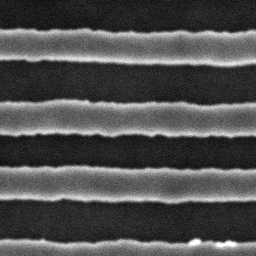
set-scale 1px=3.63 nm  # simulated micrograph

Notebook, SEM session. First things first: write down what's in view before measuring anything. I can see lines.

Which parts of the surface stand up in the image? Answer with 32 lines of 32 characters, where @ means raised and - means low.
--------------------------------
--------------------------------
--------------------------------
--------------------------------
@@@@@@@@@@@@@@@@@@@@@@@@@@@@@@@@
@@@@@@@@@@@@@@@@@@@@@@@@@@@@@@@@
@@@@@@@@@@@@@@@@@@@@@@@@@@@@@@@@
------------@@@@@@@@@@@@@@@@@@@@
--------------------------------
--------------------------------
--------------------------------
--------------------------------
--------------------------------
@@@@@@@@@@@@@@@@@@@@@@@@@@@@@@@@
@@@@@@@@@@@@@@@@@@@@@@@@@@@@@@@@
@@@@@@@@@@@@@@@@@@@@@@@@@@@@@@@@
@@@@@@@@@@@@@@@@@@@@@@@@@@@@@@@@
--------------------------------
--------------------------------
--------------------------------
--------------------------------
@@@@@@@@@@@@@@@@@@@@@@@@@@@@@@@@
@@@@@@@@@@@@@@@@@@@@@@@@@@@@@@@@
@@@@@@@@@@@@@@@@@@@@@@@@@@@@@@@@
@@@@@@@@@@@@@@@@@@@@@@@@@@@@@@@@
--------------------------------
--------------------------------
--------------------------------
--------------------------------
--------------------------------
@@@@@@@@-@@@@@@@@@@@@-@@@@@@@@@@
@@@@@@@@@@@@@@@@@@@@@@@@@@@@@@@@